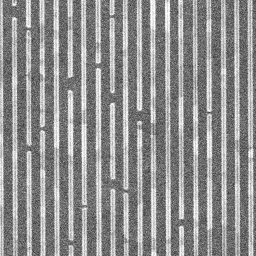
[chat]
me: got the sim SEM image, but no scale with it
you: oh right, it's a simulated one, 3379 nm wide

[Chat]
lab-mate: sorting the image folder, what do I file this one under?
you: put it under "parallel lines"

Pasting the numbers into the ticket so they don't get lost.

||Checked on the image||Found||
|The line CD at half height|36.3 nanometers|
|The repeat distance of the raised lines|183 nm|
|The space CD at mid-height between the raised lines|147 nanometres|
